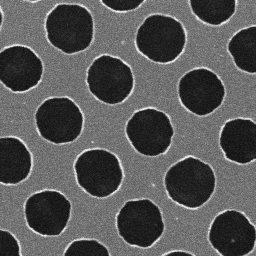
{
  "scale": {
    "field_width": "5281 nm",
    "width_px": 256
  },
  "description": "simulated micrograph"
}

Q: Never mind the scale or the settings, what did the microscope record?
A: a regular array of holes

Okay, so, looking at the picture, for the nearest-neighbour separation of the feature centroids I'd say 1340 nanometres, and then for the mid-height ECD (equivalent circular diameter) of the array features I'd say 972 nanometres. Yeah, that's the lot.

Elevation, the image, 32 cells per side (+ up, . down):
+++++++++++++.....++++++.....+++
++++++.....+++++++++++++.....+++
++++++......++++++....+++...++++
++++++......+++++......++++++++.
++++++......+++++......++++++...
+++++++....++++++......++++++...
....++++..++++++++.....++++++...
.....+++++++...++++...+++++++...
.....++++++.....++++++++++++++..
.....++++++......++++++....+++++
.....++++++......+++++......++++
+++++++++++.....++++++......++++
++++++...+++...++++++++.....++++
+++++.....+++++++++++++....+++++
++++......+++++++....+++++++++++
+++++.....++++++.....+++++++....
+++++.....++++++......++++++....
..++++...+++++++.....++++++.....
...++++++++++++++....+++++++....
....++++++....++++++++++++++....
....+++++......+++++++....++++++
....+++++......++++++......+++++
...+++++++.....++++++......+++++
++++++++++.....++++++......+++++
++++....++++.++++++++.....++++++
+++......+++++++...+++...+++++++
+++......++++++.....++++++++..++
+++......++++++.....+++++++....+
++++....+++++++.....++++++......
..+++++++++++++.....++++++......
..+++++++....+++...+++++++......
..++++++.....+++++++++.++++....+